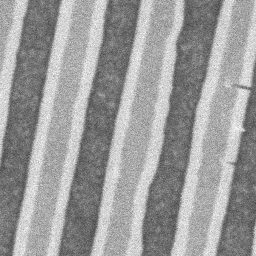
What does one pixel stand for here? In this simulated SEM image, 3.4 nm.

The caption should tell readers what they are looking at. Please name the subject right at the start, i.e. one or a few lines or trenches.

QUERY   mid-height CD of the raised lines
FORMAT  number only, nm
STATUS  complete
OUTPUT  123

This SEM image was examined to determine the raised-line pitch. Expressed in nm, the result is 264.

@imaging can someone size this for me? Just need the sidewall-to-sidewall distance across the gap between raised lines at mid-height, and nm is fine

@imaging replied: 144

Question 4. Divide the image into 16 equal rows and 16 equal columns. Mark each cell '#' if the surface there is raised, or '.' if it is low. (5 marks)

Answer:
#...##...##...##
#...##...##...##
#...##...##...##
#..###..###..###
#..###..###..###
...##...##...##.
...##...##...##.
...##...##...##.
...##..###..###.
..###..###..###.
..##...##...##..
..##...##...##..
..##...##...##..
..##..###..###..
.###..###..##...
.##...###..##...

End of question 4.